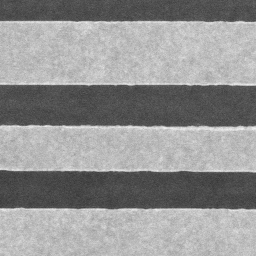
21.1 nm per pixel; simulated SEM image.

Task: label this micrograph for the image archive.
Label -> lines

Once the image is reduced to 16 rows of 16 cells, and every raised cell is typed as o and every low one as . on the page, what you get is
................
oooooooooooooooo
oooooooooooooooo
oooooooooooooooo
oooooooooooooooo
................
................
................
oooooooooooooooo
oooooooooooooooo
oooooooooooooooo
................
................
oooooooooooooooo
oooooooooooooooo
oooooooooooooooo